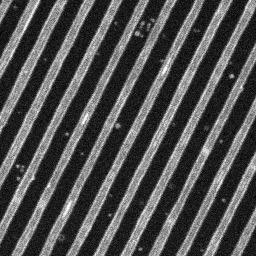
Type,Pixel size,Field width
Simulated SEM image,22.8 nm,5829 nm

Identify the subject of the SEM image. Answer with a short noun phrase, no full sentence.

parallel lines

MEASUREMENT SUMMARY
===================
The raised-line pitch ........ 0.557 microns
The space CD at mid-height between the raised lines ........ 135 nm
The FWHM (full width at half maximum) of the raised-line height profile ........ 0.419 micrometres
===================